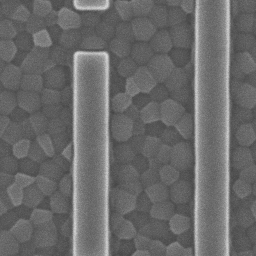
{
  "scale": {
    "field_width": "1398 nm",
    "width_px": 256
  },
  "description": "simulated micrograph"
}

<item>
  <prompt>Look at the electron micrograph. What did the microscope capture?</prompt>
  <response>one or a few lines or trenches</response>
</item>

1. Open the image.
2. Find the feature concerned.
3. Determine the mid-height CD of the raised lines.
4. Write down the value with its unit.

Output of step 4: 180 nm